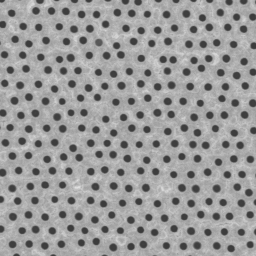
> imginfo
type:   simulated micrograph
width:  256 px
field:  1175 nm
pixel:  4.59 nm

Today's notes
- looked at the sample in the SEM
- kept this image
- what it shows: a regular array of holes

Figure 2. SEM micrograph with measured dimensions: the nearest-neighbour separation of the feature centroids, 0.0662 µm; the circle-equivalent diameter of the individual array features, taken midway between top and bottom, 32.8 nanometres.